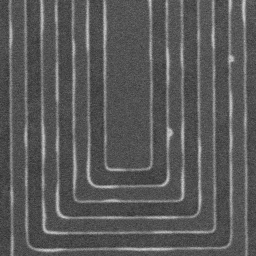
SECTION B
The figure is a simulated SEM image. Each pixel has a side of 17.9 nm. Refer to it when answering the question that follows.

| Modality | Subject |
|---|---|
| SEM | groups of lines, slits or small figures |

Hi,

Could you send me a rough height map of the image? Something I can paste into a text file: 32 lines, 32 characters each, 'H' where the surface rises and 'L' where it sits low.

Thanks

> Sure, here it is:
LHHLLHHLLHHLLHHHHHHLLHHLLHHLLHLL
LHHLLHHLLHHLLHHHHHHLLHHLLHHLLHLL
LHHLLHHLLHHLLHHHHHHLLHHLLHHLLHHL
LHHLLHHLLHHLLHHHHHHLLHHLLHHLLHHL
LHHLLHHLLHHLLHHHHHHLLHHLLHHLLHHL
LHHLLHHLLHHLLHHHHHHLLHHLLHHLLHHL
LHHLLHHLLHHLLHHHHHHLLHHLLHHLLHHL
LHHLLHHLLHHLLHHHHHHLLHHLLHHLLHHL
LHHLLHHLLHHLLHHHHHHLLHHLLHHLLHHL
LHHLLHHLLHHLLHHHHHHLLHHLLHHLLHHL
LHHLLHHLLHHLLHHHHHHLLHHLLHHLLHHL
LHHLLHHLLHHLLHHHHHHLLHHLLHHLLHHL
LHHLLHHLLHHLLHHHHHHLLHHLLHHLLHHL
LHHLLHHLLHHLLHHHHHHLLHHLLHHLLHHL
LHHLLHHLLHHLLHHHHHHLLHHLLHHLLHHL
LHHLLHHLLHHLLHHHHHHLLHHLLHHLLHHL
LHHLLHHLLHHLLHHHHHHLLHHLLHHLLHHL
LHHLLHHLLHHLLHHHHHHLLHHLLHHLLHHL
LHHLLHHLLHHLLHHHHHHLLHHLLHHLLHHL
LHHLLHHLLHHLLHHHHHHLLHHLLHHLLHHL
LHHLLHHLLHHLLHHHHHHLLHHLLHHLLHHL
LHHLLHHLLHHLLLLLLLLLLHHLLHHLLHHL
LHHLLHHLLHHLLLLLLLLLLHHLLHHLLHHL
LHHLLHHLLHHHHHHHHHHHHHHLLHHLLHHL
LLHLLHHLLHHHHHHHHHHHHHHLLHHLLHHL
LLHLLHHLLLLLLLLLLLLLLLLLLHHLLHHL
LLHLLLHLLLLLLLLLLLLLLLLLLHHLLHHL
LLHLLLHHHHHHHHHHHHHHHHHHHHHLLHHL
LLHLLLHHHHHHHHHHHHHHHHHHHHHLLHHL
LLHLLLLLLLLLLLLLLLLLLLLLLLLLLHHL
LLHHLLLLLLLLLLLLLLLLLLLLLLLLLHHL
LLHHHHHHHHHHHHHHHHHHHHHHHHHHHHHL